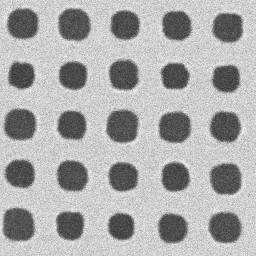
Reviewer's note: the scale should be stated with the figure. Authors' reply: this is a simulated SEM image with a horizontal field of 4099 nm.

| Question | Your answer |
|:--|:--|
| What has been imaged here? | a regular array of holes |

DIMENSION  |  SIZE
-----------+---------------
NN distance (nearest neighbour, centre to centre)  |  796 nm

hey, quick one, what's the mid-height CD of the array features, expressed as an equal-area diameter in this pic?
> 497 nm